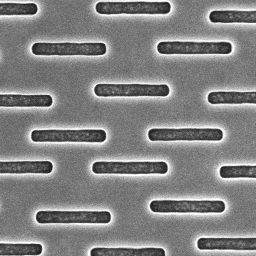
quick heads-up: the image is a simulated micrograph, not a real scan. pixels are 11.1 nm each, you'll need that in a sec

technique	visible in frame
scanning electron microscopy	a regular array of holes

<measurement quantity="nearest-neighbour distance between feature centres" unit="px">70.3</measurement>